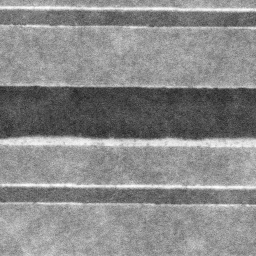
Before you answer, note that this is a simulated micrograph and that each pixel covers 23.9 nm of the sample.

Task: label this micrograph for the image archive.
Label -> lines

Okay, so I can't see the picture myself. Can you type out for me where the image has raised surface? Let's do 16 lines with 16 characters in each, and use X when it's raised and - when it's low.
XXXXXXXXXXXXXXXX
XXXXXXXXXXXXXXXX
XXXXXXXXXXXXXXXX
XXXXXXXXXXXXXXXX
XXXXXXXXXXXXXXXX
----------------
----------------
----------------
----------------
XXXXXXXXXXXXXXXX
XXXXXXXXXXXXXXXX
XXXXXXXXXXXXXXXX
XXXXXXXXXXXXXXXX
XXXXXXXXXXXXXXXX
XXXXXXXXXXXXXXXX
XXXXXXXXXXXXXXXX